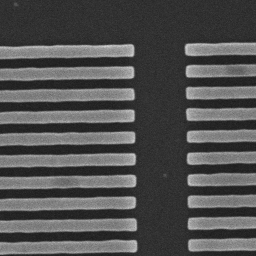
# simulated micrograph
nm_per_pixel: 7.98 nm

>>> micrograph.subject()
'groups of lines, slits or small figures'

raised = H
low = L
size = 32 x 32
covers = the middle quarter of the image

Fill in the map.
LLLLLLLLLLLLLLLLLLLLLLLLLLLLLLLH
HHHHHHHHHHHHHHHHHLLLLLLLLLLLLLLH
HHHHHHHHHHHHHHHHHLLLLLLLLLLLLLLH
HHHHHHHHHHLHHHLLLLLLLLLLLLLLLLLL
LLLLLLLLLLLLLLLLLLLLLLLLLLLLLLLL
LLLLLLLLLLLLLLLLLLLLLLLLLLLLLLLL
HHHHHHHHHHHHHHHHHLLLLLLLLLLLLLLH
HHHHHHHHHHHHHHHHHLLLLLLLLLLLLLLH
HHHHHHHHHHHHHHHHHLLLLLLLLLLLLLLH
LLLLLLLLLLLLLLLLLLLLLLLLLLLLLLLL
LLLLLLLLLLLLLLLLLLLLLLLLLLLLLLLL
LLLLLLLLLLLLLLLLLLLLLLLLLLLLLLLH
HHHHHHHHHHHHHHHHHLLLLLLLLLLLLLLH
HHHHHHHHHHHHHHHHHLLLLLLLLLLLLLLH
HHHLLHHHHHLLLLLLLLLLLLLLLLLLLLLL
LLLLLLLLLLLLLLLLLLLLLLLLLLLLLLLL
LLLLLLLLLLLLLLLLLLLLLLLLLLLLLLLL
HHHHHHHHHHHHHHHHHHLLLLLLLLLLLLLH
HHHHHHHHHHHHHHHHHHLLLLLLLLLLLLLH
HHHHHHHHHHHHHHHHHLLLLLLLLLLLLLLL
LLLLLLLLLLLLLLLLLLLLLLLLLLLLLLLL
LLLLLLLLLLLLLLLLLLLLLLLLLLLLLLLL
LLLLLLLLLLHHHLHHHLLLLLLLLLLLLLLH
HHHHHHHHHHHHHHHHHHLLLLLLLLLLLLLH
HHHHHHHHHHHHHHHHHHLLLLLLLLLLLLLH
HHHHLLLLLLLLLLLLLLLLLLLLLLLLLLLL
LLLLLLLLLLLLLLLLLLLLLLLLLLLLLLLL
LLLLLLLLLLLLLLLLLLLLLLLLLLLLLLLL
HHHHHHHHHHHHHHHHHHLLLLLLLLLLLLLH
HHHHHHHHHHHHHHHHHHLLLLLLLLLLLLLH
HHHHHHHHHHHHHHHHHLLLLLLLLLLLLLLL
LLLLLLLLLLLLLLLLLLLLLLLLLLLLLLLL